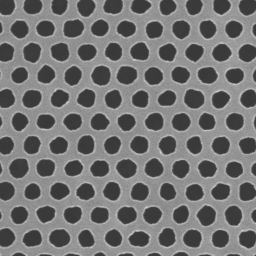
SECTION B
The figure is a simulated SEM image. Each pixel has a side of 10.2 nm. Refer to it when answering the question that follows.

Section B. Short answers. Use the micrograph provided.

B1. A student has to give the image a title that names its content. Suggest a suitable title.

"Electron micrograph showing a regular array of holes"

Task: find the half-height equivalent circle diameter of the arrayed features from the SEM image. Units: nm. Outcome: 181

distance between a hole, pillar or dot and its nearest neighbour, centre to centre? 0.266 micrometres